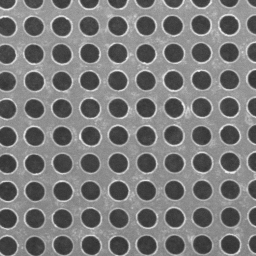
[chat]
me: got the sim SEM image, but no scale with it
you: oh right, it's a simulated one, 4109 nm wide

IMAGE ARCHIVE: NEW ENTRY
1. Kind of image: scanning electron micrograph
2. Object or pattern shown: a regular array of holes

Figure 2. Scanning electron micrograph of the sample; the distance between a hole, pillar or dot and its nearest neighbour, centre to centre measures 437 nm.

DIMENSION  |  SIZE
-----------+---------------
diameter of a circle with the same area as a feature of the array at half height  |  314 nanometers